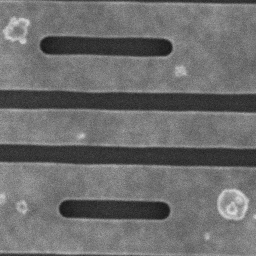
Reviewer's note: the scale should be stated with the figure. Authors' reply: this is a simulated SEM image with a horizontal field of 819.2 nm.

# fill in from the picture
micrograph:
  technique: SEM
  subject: groups of lines, slits or small figures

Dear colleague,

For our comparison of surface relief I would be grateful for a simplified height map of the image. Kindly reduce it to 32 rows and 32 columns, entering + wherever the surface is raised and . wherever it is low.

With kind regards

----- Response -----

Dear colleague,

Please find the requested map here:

++++++++++++++++++++++++++++....
++++++++++++++++++++++++++++++++
++++++++++++++++++++++++++++++++
++++++++++++++++++++++++++++++++
++++++....++++++++++++++++++++++
+++++................+++++++++++
+++++................+++++++++++
++++++++++++++++++++++++++++++++
++++++++++++++++++++++++++++++++
++++++++++++++++++++++++++++++++
++++++++++++++++++++++++++++++++
...........++...++++++++++++++++
................................
................................
++++++++++++++++++++++++++++++++
++++++++++++++++++++++++++++++++
++++++++++++++++++++++++++++++++
++++++++++++++++++++++++++++++++
................................
................................
+++++++++.......................
++++++++++++++++++++++++++++++++
++++++++++++++++++++++++++++++++
++++++++++++++++++++++++++++++++
++++++++++++++++++++++++++++++++
++++++++.............+++++++++++
+++++++..............+++++++++++
+++++++++++++.......++++++++++++
++++++++++++++++++++++++++++++++
++++++++++++++++++++++++++++++++
++++++++++++++++++++++++++++++++
++++++++++++++++++++++++++++++++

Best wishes